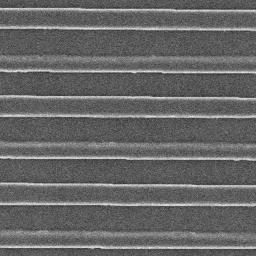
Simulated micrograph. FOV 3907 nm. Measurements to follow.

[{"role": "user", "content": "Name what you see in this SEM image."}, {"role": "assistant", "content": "lines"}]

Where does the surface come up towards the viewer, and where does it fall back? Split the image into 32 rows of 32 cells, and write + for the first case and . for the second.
................................
++++++++++++++++++++++++++++++++
++++++++++++++++++++++++++++++++
++++++++++++++++++++++++++++++++
................................
................................
................................
++++++++++++++++++++++++++++++++
++++++++++++++++++++++++++++++++
................................
................................
................................
++++++++++++++++++++++++++++++++
++++++++++++++++++++++++++++++++
++++++++++++++++++++++++++++++++
................................
................................
................................
++++++++++++++++++++++++++++++++
++++++++++++++++++++++++++++++++
................................
................................
................................
++++++++++++++++++++++++++++++++
++++++++++++++++++++++++++++++++
++++++++++++++++++++++++++++++++
................................
................................
................................
++++++++++++++++++++++++++++++++
++++++++++++++++++++++++++++++++
................................